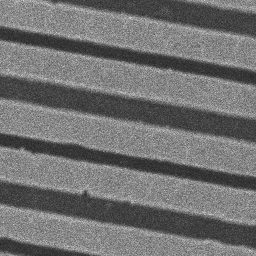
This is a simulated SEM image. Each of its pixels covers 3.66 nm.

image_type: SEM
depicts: parallel lines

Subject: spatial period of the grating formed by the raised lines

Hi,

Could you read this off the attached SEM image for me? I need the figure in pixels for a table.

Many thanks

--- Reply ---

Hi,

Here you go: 51.3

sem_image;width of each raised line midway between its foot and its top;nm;121